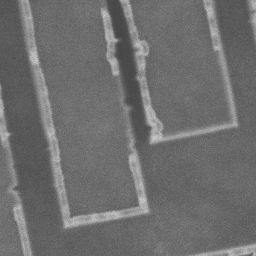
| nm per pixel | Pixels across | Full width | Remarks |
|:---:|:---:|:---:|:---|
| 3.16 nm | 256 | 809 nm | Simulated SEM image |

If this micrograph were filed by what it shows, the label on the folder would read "one or a few lines or trenches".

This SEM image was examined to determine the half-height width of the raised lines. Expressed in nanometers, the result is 269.